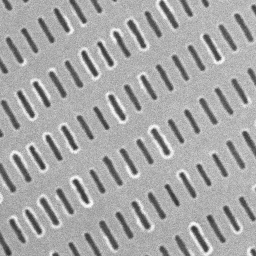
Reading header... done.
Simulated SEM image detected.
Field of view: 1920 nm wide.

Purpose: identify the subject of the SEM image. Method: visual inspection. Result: a regular array of holes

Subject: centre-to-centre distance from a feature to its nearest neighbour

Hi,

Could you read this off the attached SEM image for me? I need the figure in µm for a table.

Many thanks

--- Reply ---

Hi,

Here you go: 0.14